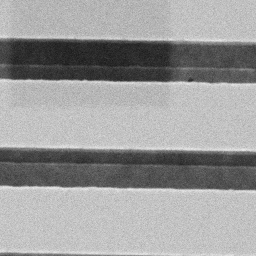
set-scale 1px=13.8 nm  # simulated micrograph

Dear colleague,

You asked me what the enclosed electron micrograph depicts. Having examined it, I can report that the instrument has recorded lines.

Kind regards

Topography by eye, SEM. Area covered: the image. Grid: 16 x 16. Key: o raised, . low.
oooooooooooooooo
oooooooooooooooo
............oooo
................
................
oooooooooooooooo
oooooooooooooooo
oooooooooooooooo
oooooooooooooooo
................
................
................
oooooooooooooooo
oooooooooooooooo
oooooooooooooooo
oooooooooooooooo